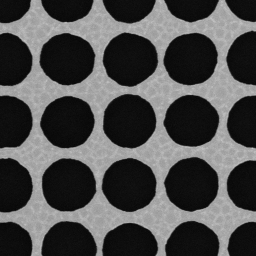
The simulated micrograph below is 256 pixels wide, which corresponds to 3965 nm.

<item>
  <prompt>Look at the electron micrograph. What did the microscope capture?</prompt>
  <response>a regular array of holes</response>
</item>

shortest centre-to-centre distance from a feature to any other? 954 nanometres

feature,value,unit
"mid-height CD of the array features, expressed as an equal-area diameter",0.83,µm